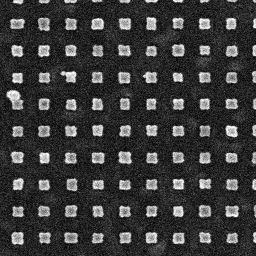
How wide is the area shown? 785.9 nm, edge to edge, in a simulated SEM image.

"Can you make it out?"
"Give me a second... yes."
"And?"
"a regular array of raised bodies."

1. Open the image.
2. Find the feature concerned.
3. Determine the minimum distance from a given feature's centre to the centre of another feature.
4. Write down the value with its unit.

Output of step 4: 80.7 nm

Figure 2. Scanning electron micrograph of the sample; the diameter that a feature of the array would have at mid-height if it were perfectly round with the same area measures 34.8 nanometers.